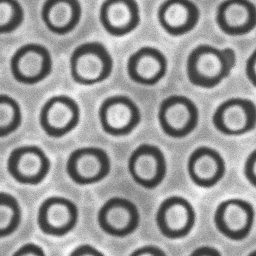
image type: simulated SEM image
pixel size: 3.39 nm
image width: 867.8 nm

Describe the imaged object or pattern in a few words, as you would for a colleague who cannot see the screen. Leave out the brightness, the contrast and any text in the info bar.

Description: a regular array of ring-shaped grooves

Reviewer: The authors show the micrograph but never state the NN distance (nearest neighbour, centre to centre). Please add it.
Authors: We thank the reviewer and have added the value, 193 nm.